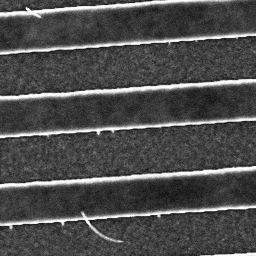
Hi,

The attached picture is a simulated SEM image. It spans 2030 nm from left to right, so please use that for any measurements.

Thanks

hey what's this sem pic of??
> lines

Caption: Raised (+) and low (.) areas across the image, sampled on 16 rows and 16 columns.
....++++++++++++
++++++++++++++++
++++++++++++....
................
................
.........+++++++
++++++++++++++++
++++++++++++++++
++..............
................
...............+
..++++++++++++++
++++++++++++++++
+++++++++.......
................
................